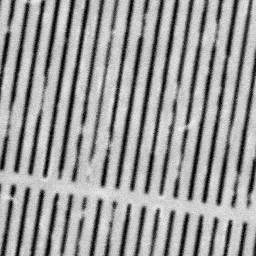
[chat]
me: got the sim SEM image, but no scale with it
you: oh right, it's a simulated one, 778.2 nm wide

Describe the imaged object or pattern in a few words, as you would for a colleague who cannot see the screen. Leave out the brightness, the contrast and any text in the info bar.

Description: parallel lines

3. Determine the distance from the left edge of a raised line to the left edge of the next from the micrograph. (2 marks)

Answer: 44.5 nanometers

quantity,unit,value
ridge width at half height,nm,33.1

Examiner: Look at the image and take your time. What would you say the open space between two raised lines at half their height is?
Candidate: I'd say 12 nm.